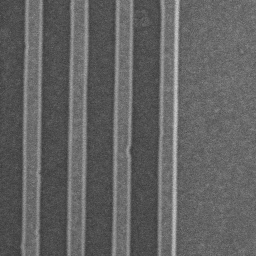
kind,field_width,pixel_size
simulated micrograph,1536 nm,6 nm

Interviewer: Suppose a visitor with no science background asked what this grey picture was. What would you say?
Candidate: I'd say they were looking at parallel lines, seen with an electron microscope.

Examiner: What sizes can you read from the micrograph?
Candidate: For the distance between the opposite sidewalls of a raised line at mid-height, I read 89.2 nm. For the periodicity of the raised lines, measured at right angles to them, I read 0.272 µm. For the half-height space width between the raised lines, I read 183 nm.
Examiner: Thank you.